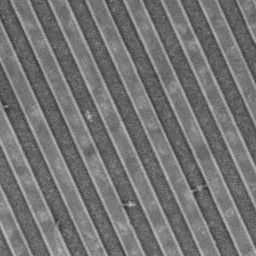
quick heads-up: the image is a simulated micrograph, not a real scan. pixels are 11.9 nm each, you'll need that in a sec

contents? parallel lines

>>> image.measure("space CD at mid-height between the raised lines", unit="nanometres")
230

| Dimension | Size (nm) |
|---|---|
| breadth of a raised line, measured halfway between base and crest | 184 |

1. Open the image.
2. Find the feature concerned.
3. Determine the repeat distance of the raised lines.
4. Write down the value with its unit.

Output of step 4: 34.2 pixels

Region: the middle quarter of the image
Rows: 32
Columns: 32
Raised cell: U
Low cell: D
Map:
DDDDUUUUDDDDDUUUUDDDDDUUUUUDDDDD
DDDDUUUUDDDDDDUUUUDDDDDUUUUDDDDD
DDDDDUUUUDDDDDUUUUDDDDDUUUUUDDDD
DDDDDUUUUDDDDDDUUUUDDDDDUUUUDDDD
DDDDDDUUUUDDDDDUUUUDDDDDUUUUDDDD
UDDDDDUUUUDDDDDUUUUUDDDDDUUUUDDD
UDDDDDDUUUUDDDDDUUUUDDDDDUUUUDDD
UUDDDDDUUUUDDDDDUUUUUDDDDDUUUUDD
UUDDDDDUUUUUDDDDDUUUUDDDDDUUUUDD
UUUDDDDDUUUUDDDDDUUUUDDDDDDUUUUD
UUUDDDDDUUUUDDDDDDUUUUDDDDDUUUUD
UUUDDDDDDUUUUDDDDDUUUUDDDDDUUUUU
UUUUDDDDDUUUUDDDDDDUUUUDDDDDUUUU
UUUUDDDDDDUUUUDDDDDUUUUDDDDDUUUU
DUUUUDDDDDUUUUDDDDDDUUUUDDDDDUUU
DUUUUDDDDDDUUUUDDDDDUUUUDDDDDUUU
DDUUUUDDDDDUUUUDDDDDUUUUUDDDDDUU
DDUUUUDDDDDDUUUDDDDDDUUUUDDDDDUU
DDUUUUUDDDDDUUUUDDDDDUUUUUDDDDDU
DDDUUUUDDDDDUUUUDDDDDDUUUUDDDDDU
DDDUUUUUDDDDDUUUUDDDDDUUUUDDDDDD
DDDDUUUUDDDDDUUUUDDDDDDUUUUDDDDD
DDDDUUUUDDDDDDUUUUDDDDDUUUUDDDDD
DDDDDUUUUDDDDDUUUUDDDDDDUUUUDDDD
DDDDDUUUUDDDDDDUUUUDDDDDUUUUDDDD
DDDDDDUUUUDDDDDUUUUDDDDDDUUUUDDD
UDDDDDUUUUDDDDDDUUUUDDDDDUUUUDDD
UDDDDDDUUUUDDDDDUUUUDDDDDUUUUUDD
UUDDDDDUUUUDDDDDDUUUUDDDDDUUUUDD
UUDDDDDUUUUUDDDDDUUUUDDDDDUUUUUD
UUUDDDDDUUUUDDDDDUUUUUDDDDDUUUUD
UUUDDDDDUUUUUDDDDDUUUUDDDDDUUUUU